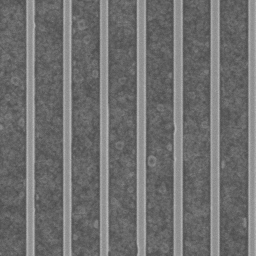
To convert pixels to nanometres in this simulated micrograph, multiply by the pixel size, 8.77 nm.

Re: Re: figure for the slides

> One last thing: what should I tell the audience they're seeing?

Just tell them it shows parallel lines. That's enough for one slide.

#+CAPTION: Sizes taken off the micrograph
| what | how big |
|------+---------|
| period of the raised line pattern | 324 nm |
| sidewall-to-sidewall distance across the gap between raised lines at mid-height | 256 nanometers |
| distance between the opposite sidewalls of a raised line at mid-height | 8.06 px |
